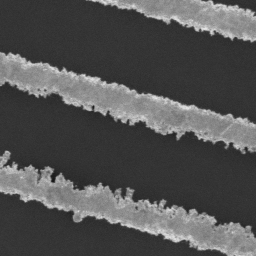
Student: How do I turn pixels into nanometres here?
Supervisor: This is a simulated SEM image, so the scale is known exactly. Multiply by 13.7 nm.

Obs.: one or a few lines or trenches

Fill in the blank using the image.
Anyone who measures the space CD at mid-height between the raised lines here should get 78.5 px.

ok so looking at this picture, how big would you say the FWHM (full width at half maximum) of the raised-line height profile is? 358 nanometres